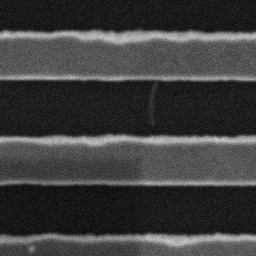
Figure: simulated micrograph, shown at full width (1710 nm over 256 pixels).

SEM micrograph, lines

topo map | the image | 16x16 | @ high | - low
----------------
----------------
@@@@@@@@@@@@@@@@
@@@@@@@@@@@@@@@@
@@@@@@@@@@@@@@@@
----------------
----------------
----------------
-------@--------
@@@@@@@@@@@@@@@@
@@@@@@@@@@@@@@@@
@-@@@@@@@@@@@@@@
----------------
----------------
----------------
@@@@@@@@@@@@@@@@